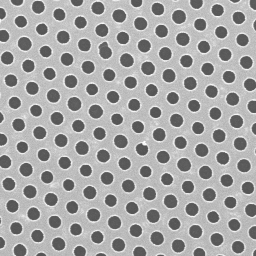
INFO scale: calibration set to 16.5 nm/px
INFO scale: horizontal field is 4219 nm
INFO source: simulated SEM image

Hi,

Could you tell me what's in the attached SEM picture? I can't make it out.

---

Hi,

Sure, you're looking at a regular array of holes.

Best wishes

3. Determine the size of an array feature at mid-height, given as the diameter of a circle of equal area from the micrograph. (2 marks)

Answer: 0.214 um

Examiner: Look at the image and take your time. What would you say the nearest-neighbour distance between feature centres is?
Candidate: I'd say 369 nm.